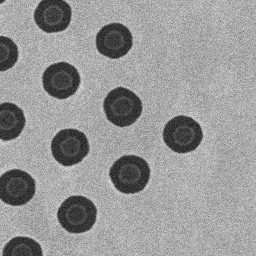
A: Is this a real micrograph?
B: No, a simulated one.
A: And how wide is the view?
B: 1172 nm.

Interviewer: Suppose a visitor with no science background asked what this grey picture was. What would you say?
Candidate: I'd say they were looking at ring-shaped grooves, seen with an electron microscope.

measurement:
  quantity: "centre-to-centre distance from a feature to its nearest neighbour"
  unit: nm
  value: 303